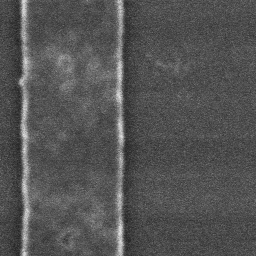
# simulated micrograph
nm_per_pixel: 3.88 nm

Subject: one or a few lines or trenches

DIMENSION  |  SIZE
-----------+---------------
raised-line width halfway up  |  379 nanometres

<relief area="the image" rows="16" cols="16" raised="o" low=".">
.ooooooo........
.ooooooo........
.ooooooo........
.ooooooo........
.ooooooo........
.ooooooo........
..oooooo........
.ooooooo........
.ooooooo........
..oooooo........
..oooooo........
.ooooooo........
..oooooo........
..oooooo........
..oooooo........
.ooooooo........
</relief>